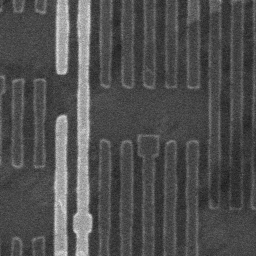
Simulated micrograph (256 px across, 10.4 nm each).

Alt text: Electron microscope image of wiring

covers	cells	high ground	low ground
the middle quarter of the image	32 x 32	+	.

+...++...+++...++...+++...++...+
+...++...++....++...+++...++...+
....++...++....++...+++...++...+
....++...++....++...+++...++...+
....++...++....++...+++...++...+
....++....+....++...+++...++...+
....++..........................
....++..........................
....++..........................
....++..........................
....++..........................
....++..........................
....++..........................
....++..........................
+...++..........................
+...++..........................
+...++..........................
+...++..........................
+...++.............+++++........
+...++...++....+...+++++...+....
....++...++....++..+++++..++...+
....++...++...+++..+++++..++...+
....++...+++..+++..+++++..++...+
....++...+++..+++...+++..+++...+
....++...+++..+++...++...+++...+
....++...+++..+++...++...+++...+
....++...+++..+++...++...+++...+
+...++...+++..+++...++...+++...+
+...++...+++..+++...++...+++...+
+...++...++...+++...++...+++...+
+...++...++...+++...++...+++...+
+..+++...++...+++...++...+++...+